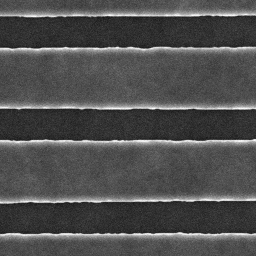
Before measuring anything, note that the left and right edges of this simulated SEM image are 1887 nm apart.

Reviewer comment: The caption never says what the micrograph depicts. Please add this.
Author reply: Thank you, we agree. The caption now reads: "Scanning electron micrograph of lines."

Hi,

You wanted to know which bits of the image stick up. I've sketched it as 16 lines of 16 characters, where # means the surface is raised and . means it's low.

################
................
................
################
################
################
################
................
................
################
################
################
################
................
................
################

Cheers